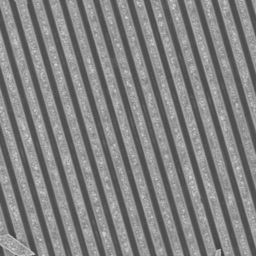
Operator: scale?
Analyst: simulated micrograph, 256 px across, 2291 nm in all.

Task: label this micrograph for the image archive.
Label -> parallel lines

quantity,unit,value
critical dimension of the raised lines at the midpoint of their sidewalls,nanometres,85.9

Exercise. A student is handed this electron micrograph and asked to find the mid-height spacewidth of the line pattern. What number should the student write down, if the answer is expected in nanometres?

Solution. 54.8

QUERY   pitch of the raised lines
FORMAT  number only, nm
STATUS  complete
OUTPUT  145